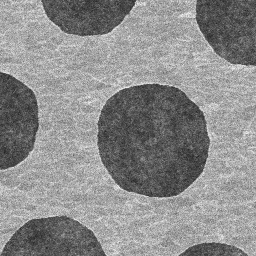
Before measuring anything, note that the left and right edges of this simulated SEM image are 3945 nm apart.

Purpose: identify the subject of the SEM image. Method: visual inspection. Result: holes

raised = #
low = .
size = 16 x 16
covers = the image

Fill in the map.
###.....####....
###....#####....
#############...
##############..
################
..######...#####
..#####.....####
..####.......###
..####.......###
..####.......###
.######......###
#######.....####
################
################
#.....##########
......######...#